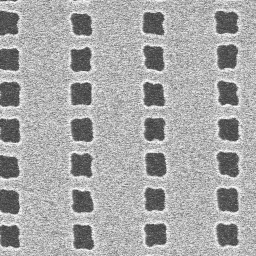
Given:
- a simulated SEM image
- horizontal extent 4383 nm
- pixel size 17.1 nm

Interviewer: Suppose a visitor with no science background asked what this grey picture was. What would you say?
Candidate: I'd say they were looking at a regular array of holes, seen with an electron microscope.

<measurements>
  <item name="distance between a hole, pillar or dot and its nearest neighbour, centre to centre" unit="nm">596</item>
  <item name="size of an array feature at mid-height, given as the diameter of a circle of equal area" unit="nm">420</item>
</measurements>